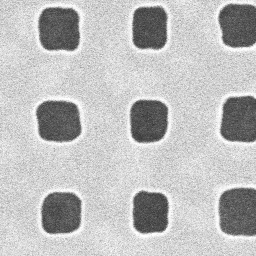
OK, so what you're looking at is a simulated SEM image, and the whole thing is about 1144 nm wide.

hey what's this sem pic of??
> holes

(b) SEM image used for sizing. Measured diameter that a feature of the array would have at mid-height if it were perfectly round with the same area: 196 nm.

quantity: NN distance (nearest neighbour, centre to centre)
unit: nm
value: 403